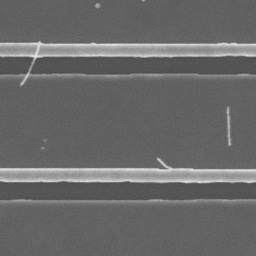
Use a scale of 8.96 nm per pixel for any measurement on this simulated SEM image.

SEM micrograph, lines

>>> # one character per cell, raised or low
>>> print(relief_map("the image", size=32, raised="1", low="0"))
11111111111111111111111111111111
11111111111111111111111111111111
11111111111111111111111111111111
11111111111111111111111111111111
11111111111111111111111111111111
11111111111111111111111111111111
11111111111111111111111111111111
00000000000000000000000000000000
00000000000000000000000000000000
11111111111111111111111111111111
11111111111111111111111111111111
11111111111111111111111111111111
11111111111111111111111111111111
11111111111111111111111111111111
11111111111111111111111111111111
11111111111111111111111111111111
11111111111111111111111111111111
11111111111111111111111111111111
11111111111111111111111111111111
11111111111111111111111111111111
11111111111111111111111111111111
11111111111111111111111111111111
11111111111111111111111111111111
00000000000000000000000000000000
00000000000000000000000000000000
11111111111111111111111111111111
11111111111111111111111111111111
11111111111111111111111111111111
11111111111111111111111111111111
11111111111111111111111111111111
11111111111111111111111111111111
11111111111111111111111111111111